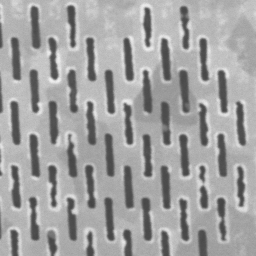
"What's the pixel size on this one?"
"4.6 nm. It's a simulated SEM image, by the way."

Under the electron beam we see a regular array of holes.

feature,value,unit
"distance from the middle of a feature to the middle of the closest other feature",165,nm